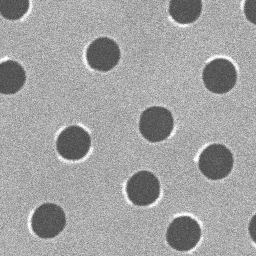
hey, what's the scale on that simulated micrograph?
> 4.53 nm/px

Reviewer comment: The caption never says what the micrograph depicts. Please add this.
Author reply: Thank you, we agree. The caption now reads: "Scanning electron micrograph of a regular array of holes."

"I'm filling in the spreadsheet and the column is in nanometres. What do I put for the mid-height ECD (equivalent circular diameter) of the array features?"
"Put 162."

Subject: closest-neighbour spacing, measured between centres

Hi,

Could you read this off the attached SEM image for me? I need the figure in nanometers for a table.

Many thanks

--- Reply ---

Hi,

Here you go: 341